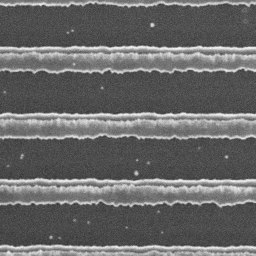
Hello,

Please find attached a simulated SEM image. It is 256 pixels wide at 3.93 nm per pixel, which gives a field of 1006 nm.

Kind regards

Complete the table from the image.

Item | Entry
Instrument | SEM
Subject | lines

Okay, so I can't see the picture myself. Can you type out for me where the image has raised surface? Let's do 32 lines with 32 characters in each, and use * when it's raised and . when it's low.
***********...******..****...***
................................
................................
................................
................................
................................
********************************
********************************
********************************
................................
................................
................................
................................
................................
********************************
********************************
********************************
................................
................................
................................
................................
................................
*...**...***.......*.....*......
********************************
********************************
*..*......*..*****.*.*..*..**...
................................
................................
................................
................................
................................
********************************